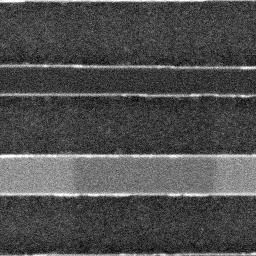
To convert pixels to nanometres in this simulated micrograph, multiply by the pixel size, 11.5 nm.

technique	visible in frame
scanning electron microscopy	lines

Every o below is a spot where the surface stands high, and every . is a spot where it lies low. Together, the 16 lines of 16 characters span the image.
................
................
................
................
oooooooooooooooo
oooooooooooooooo
................
................
................
................
oooooooooooooooo
oooooooooooooooo
................
................
................
................